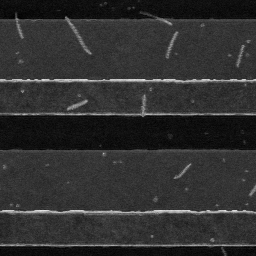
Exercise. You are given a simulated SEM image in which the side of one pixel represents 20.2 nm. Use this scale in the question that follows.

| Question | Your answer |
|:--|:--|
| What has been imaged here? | lines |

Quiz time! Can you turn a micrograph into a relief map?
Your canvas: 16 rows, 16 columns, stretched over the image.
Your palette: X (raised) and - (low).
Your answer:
----------------
XXXXXXXXXXXXXXXX
XXXXXXXXXXXXXXXX
XXXXXXXXXXXXXXXX
XXXXXXXXXXXXXXXX
XXXXXXXXXXXXXXXX
XXXXXXXXXXXXXXXX
----------------
----------------
XXXXXXXXXXXXXXXX
XXXXXXXXXXXXXXXX
XXXXXXXXXXXXXXXX
XXXXXXXXXXXXXXXX
XXXXXXXXXXXXXXXX
XXXXXXXXXXXXXXXX
----------------